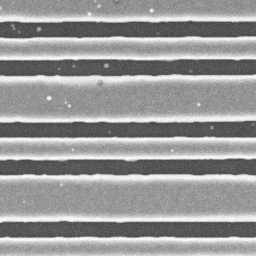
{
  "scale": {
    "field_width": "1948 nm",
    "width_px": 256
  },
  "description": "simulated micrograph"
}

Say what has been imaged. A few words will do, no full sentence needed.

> lines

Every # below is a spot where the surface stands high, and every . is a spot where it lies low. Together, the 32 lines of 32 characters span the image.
################################
################################
..####################.....####.
................................
................................
################################
################################
................................
................................
....................###.......##
################################
################################
################################
################################
################################
................................
................................
################################
################################
################################
................................
................................
################################
################################
################################
################################
################################
################################
................................
................................
################################
################################